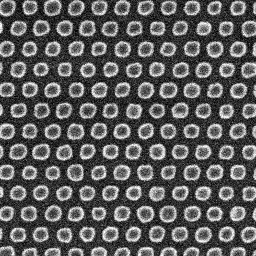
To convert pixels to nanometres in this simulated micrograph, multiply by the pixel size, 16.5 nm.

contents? a regular array of raised bodies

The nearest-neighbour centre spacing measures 374 nanometers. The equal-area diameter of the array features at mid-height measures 244 nm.